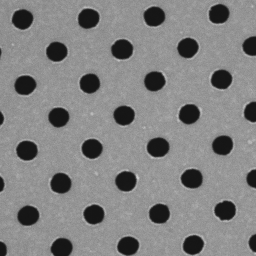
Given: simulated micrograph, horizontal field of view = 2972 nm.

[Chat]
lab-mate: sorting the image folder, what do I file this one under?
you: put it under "a regular array of holes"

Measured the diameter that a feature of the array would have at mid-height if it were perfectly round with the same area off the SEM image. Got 0.243 microns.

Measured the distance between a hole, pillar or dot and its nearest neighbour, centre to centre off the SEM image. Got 532 nm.